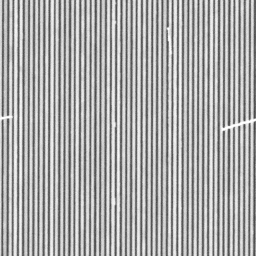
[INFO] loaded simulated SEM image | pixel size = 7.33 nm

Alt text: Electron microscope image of parallel lines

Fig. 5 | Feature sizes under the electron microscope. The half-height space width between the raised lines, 0.0211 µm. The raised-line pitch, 0.0376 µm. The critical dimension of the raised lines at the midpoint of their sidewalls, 21.1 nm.